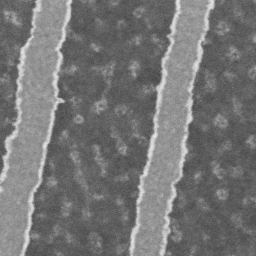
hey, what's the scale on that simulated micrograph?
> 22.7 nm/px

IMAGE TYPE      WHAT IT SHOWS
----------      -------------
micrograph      one or a few lines or trenches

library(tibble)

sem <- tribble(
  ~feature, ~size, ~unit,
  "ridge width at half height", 738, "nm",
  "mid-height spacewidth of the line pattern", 2350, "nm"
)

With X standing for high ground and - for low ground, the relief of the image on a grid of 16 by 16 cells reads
--XX-------XX---
--XX-------XX---
--XX-------XX---
-XXX------XX----
-XXX------XX----
-XX-------XX----
-XXX------XX----
-XX-------XX----
-XX-------XX----
XXX------XX-----
XXX------XX-----
XX-------XX-----
XX-------XX-----
XX-------XX-----
XX------XX------
XX------XX------